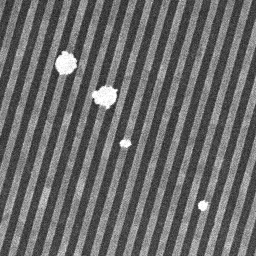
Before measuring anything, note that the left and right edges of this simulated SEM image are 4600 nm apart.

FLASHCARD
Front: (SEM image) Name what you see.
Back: parallel lines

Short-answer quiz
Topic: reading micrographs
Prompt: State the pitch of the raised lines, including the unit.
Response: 0.283 µm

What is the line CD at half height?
121 nm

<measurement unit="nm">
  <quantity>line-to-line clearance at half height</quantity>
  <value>158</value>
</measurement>